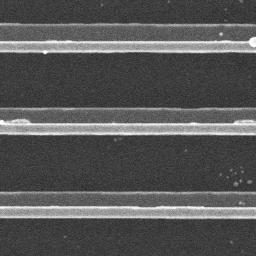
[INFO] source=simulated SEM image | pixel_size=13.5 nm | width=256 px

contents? lines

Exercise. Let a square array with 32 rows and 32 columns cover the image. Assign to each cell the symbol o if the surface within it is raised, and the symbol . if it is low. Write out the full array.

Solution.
................................
................................
................................
oooooooooooooooooooooooooooooooo
oooooooooooooooooooooooooooooooo
oooooooooooooooooooooooooooooooo
.....o.......o........oooo.....o
................................
................................
................................
................................
................................
................................
................................
oooooooooooooooooooooooooooooooo
oooooooooooooooooooooooooooooooo
oooooooooooooooooooooooooooooooo
................................
................................
................................
................................
................................
................................
................................
oooooooooooooooooooooooooooooooo
oooooooooooooooooooooooooooooooo
oooooooooooooooooooooooooooooooo
................................
................................
................................
................................
................................